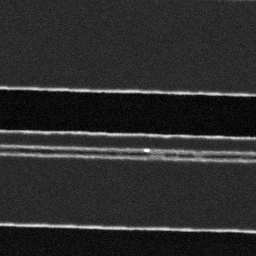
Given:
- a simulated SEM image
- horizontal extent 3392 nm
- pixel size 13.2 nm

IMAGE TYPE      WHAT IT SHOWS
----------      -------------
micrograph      lines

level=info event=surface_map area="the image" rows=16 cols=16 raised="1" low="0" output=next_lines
1111111111111111
1111111111111111
1111111111111111
1111111111111111
1111111111111111
0011111111111111
0000000000000000
0000000000000000
1111111111000000
1111111111111111
1111111111111111
1111111111111111
1111111111111111
1111111111111111
0000000000000000
0000000000000000